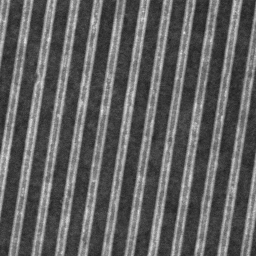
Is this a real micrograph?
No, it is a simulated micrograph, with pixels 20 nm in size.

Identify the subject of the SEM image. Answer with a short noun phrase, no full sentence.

parallel lines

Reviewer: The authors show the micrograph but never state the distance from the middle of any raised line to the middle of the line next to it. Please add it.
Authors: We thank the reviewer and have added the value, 458 nm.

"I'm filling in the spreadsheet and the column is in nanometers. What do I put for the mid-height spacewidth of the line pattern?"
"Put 311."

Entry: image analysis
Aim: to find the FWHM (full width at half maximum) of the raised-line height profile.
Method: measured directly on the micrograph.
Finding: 156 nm